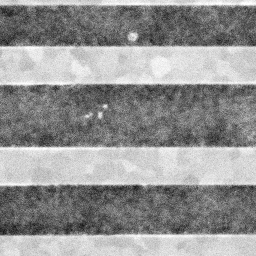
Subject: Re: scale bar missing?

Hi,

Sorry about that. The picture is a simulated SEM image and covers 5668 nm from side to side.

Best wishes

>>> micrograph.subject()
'lines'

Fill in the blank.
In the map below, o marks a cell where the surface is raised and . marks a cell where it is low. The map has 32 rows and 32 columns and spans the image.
oooooooooooooooooooooooooooooooo
................................
................................
................................
................................
................................
oooooooooooooooooooooooooooooooo
oooooooooooooooooooooooooooooooo
oooooooooooooooooooooooooooooooo
oooooooooooooooooooooooooooooooo
................................
................................
................................
................................
................................
................................
................................
................................
................................
oooooooooooooooooooooooooooooooo
oooooooooooooooooooooooooooooooo
oooooooooooooooooooooooooooooooo
oooooooooooooooooooooooooooooooo
................................
................................
................................
................................
................................
................................
............oooooooooooooooooooo
oooooooooooooooooooooooooooooooo
oooooooooooooooooooooooooooooooo